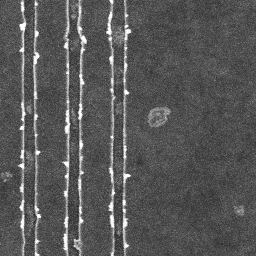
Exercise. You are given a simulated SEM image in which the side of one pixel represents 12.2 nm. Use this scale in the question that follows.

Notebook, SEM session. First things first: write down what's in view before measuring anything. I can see parallel lines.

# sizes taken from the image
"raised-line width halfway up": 402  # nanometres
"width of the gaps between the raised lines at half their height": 0.141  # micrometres